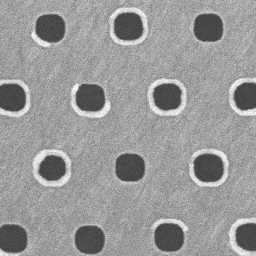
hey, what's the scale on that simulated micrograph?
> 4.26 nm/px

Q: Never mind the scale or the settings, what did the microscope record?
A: a regular array of holes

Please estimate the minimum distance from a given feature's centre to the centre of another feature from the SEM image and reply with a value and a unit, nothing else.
332 nm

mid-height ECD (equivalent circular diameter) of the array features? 30 px